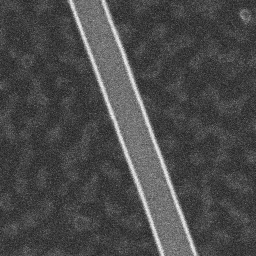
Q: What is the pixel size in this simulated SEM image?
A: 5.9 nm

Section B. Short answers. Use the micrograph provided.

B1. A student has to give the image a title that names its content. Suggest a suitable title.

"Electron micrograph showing one or a few lines or trenches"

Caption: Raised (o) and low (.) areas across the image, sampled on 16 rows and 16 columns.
ooooo..ooooooooo
ooooo..ooooooooo
ooooo..ooooooooo
oooooo..oooooooo
oooooo..oooooooo
oooooo..oooooooo
ooooooo..ooooooo
ooooooo..ooooooo
ooooooo...oooooo
oooooooo..oooooo
oooooooo..oooooo
ooooooooo..ooooo
ooooooooo..ooooo
ooooooooo..ooooo
oooooooooo..oooo
oooooooooo..oooo